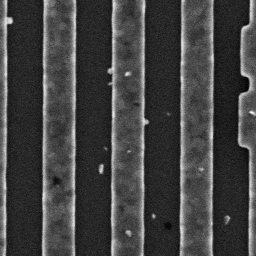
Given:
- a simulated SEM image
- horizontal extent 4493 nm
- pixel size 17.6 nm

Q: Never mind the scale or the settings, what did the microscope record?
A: wiring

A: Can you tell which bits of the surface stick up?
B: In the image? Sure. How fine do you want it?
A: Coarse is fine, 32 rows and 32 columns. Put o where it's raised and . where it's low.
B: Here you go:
o.....ooo.....oooo.....oooo....o
o.....ooo.....oooo.....oooo....o
o.....ooo.....oooo.....oooo....o
o.....ooo.....oooo.....oooo...oo
o.....ooo.....oooo.....oooo...oo
o....oooo.....oooo.....oooo...oo
o....oooo.....oooo.....oooo...oo
o....oooo.....oooo.....oooo...oo
o....oooo.....oooo.....oooo...oo
o....oooo.....oooo.....oooo....o
o....oooo.....oooo.....oooo....o
o.....ooo.....oooo.....oooo....o
o.....ooo.....oooo.....oooo...oo
o....oooo.....oooo.....oooo...oo
o....oooo.....oooo.....oooo...oo
o....oooo.....oooo.....oooo...oo
o....oooo.....oooo.....oooo...oo
o....oooo.....oooo.....ooo....oo
o....oooo.....oooo.....ooo.....o
o....oooo.....oooo.....ooo.....o
o....oooo.....oooo.....ooo.....o
o....oooo.....oooo.....ooo.....o
o....oooo.....oooo.....ooo.....o
o....oooo.....oooo.....ooo.....o
o....oooo.....oooo.....ooo.....o
o....oooo.....oooo.....ooo.....o
o....oooo.....oooo.....ooo.....o
o....oooo.....oooo.....ooo.....o
o....oooo.....oooo.....ooo.....o
o....oooo.....oooo.....ooo.....o
o....oooo.....oooo.....ooo.....o
o....oooo.....oooo.....oooo....o